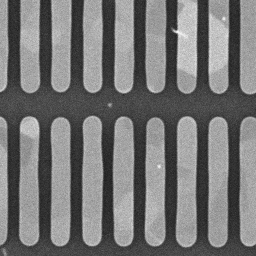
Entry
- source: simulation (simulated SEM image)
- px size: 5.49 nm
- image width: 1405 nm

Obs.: groups of lines, slits or small figures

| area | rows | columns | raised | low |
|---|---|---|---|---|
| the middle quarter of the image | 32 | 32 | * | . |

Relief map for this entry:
*....****....****...*****...****
*....****....****...*****...****
*....****....****....****...****
*....****....****....****...****
*....****....****....****...****
*....****....****....****...****
......***....***.....***.....***
................................
................................
................................
................................
................................
................................
......**......**..............**
*....****....****....****....***
*....****....****....****...****
*....****....****....****...****
*....****....****....****...****
*....****....****....****...****
*....****....****....****...****
*....****....****....****...****
*....****...*****....****...****
*....****...*****....****...****
*....****...*****....****...****
*....****...*****...*****...****
*....****...*****...*****...****
*....*****..*****...*****...****
*....*****..*****...*****...****
*....*****..*****...*****...****
*....****...*****....****...****
*....****...*****....****...****
*....****...*****....****...****